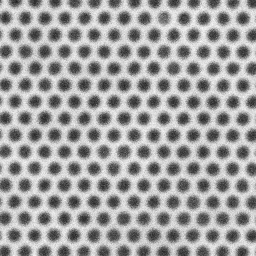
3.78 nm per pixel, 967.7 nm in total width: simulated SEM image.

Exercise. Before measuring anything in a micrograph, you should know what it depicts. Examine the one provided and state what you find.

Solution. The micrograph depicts a regular array of holes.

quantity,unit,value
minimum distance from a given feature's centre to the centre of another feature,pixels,19.2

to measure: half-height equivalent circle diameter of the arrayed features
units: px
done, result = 14.4